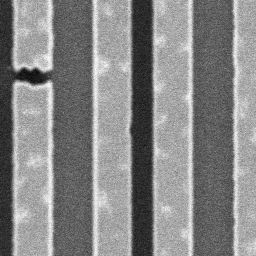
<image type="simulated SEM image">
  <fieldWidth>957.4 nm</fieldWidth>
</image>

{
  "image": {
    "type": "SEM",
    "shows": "one or a few lines or trenches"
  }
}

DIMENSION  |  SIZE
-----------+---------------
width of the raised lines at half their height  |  138 nm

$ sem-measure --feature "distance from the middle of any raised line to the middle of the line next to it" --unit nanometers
260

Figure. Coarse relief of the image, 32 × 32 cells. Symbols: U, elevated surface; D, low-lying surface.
DDUUUUDDDDDDUUUUDDDUUUUUDDDDDUUU
DDUUUUDDDDDDUUUUDDDUUUUUDDDDDUUU
DDUUUUDDDDDDUUUUDDDUUUUUDDDDDUUU
DDUUUUDDDDDDUUUUDDDUUUUUDDDDDUUU
DDUUUUDDDDDDUUUUDDDUUUUUDDDDDUUU
DDUUUUDDDDDDUUUUDDDUUUUUDDDDDUUU
DDUUUUDDDDDDUUUUDDDUUUUUDDDDDUUU
DDUUUUDDDDDDUUUUDDDUUUUUDDDDDUUU
DDUUUUDDDDDDUUUUDDDUUUUUDDDDDUUU
DDDDDDDDDDDDUUUUDDDUUUUUDDDDDUUU
DDUUDDDDDDDDUUUUDDDUUUUUDDDDDUUU
DDUUUUDDDDDDUUUUDDDUUUUUDDDDDUUU
DDUUUUDDDDDDUUUUDDDUUUUUDDDDDUUU
DDUUUUDDDDDDUUUUDDDUUUUUDDDDDUUU
DDUUUUDDDDDDUUUUDDDUUUUUDDDDDUUU
DDUUUUDDDDDDUUUUDDDUUUUUDDDDDUUU
DDUUUUDDDDDDUUUUDDDUUUUUDDDDDUUU
DDUUUUDDDDDDUUUUDDDUUUUUDDDDDUUU
DDUUUUDDDDDDUUUUDDDUUUUUDDDDDUUU
DDUUUUDDDDDDUUUUDDDUUUUUDDDDDUUU
DDUUUUDDDDDDUUUUDDDUUUUUDDDDDUUU
DDUUUUDDDDDDUUUUDDDUUUUUDDDDDUUU
DDUUUUDDDDDDUUUUDDDUUUUUDDDDDUUU
DDUUUUDDDDDDUUUUDDDUUUUUDDDDDUUU
DDUUUUDDDDDDUUUUDDDUUUUUDDDDDUUU
DDUUUUDDDDDDUUUUDDDUUUUUDDDDDUUU
DDUUUUDDDDDDUUUUDDDUUUUUDDDDDUUU
DDUUUUDDDDDDUUUUDDDUUUUUDDDDDUUU
DDUUUUDDDDDDUUUUDDDUUUUUDDDDDUUU
DDUUUUDDDDDDUUUUDDDUUUUUDDDDDUUU
DDUUUUDDDDDDUUUUDDDUUUUUDDDDDUUU
DDUUUUDDDDDDUUUUDDDUUUUUDDDDDUUU